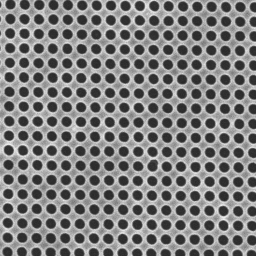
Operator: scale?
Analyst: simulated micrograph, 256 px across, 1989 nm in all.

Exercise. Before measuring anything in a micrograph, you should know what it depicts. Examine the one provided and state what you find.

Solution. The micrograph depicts a regular array of holes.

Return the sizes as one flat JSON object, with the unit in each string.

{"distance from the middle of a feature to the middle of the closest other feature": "110 nm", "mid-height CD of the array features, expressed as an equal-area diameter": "0.0822 microns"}